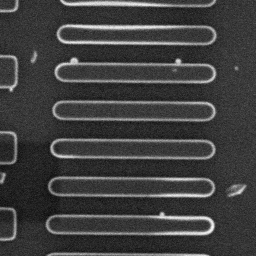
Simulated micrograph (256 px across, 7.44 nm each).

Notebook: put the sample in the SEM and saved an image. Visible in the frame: groups of lines, slits or small figures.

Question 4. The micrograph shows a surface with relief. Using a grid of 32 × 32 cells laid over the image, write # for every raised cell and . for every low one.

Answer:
##......###################.....
................................
................................
........##################......
.......####################.....
................................
................................
##..............................
##.....####################.....
##.....####################.....
##..............................
................................
................................
.......####################.....
.......####################.....
................................
................................
##.....###########..............
##....#####################.....
##.....###################......
................................
................................
.......###################......
......#####################.....
................................
................................
##..............................
##....####################......
##....#####################.....
##..............................
................................
................................